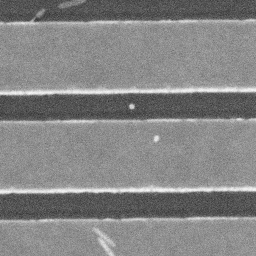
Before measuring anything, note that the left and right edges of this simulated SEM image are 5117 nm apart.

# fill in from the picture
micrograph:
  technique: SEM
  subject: lines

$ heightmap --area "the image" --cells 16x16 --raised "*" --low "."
................
****************
****************
****************
****************
****************
................
..............**
****************
****************
****************
****************
................
................
****************
****************